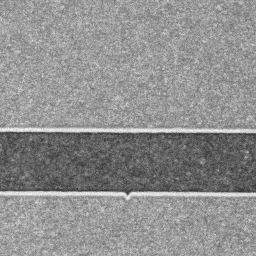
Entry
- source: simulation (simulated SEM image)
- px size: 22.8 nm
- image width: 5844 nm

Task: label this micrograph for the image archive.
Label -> one or a few lines or trenches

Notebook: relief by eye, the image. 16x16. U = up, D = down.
UUUUUUUUUUUUUUUU
UUUUUUUUUUUUUUUU
UUUUUUUUUUUUUUUU
UUUUUUUUUUUUUUUU
UUUUUUUUUUUUUUUU
UUUUUUUUUUUUUUUU
UUUUUUUUUUUUUUUU
UUUUUUUUUUUUUUUU
DDDDDDDDDDDDDDDD
DDDDDDDDDDDDDDDD
DDDDDDDDDDDDDDDD
DDDDDDDDDDDDDDDD
UUUUUUUUUUUUUUUU
UUUUUUUUUUUUUUUU
UUUUUUUUUUUUUUUU
UUUUUUUUUUUUUUUU